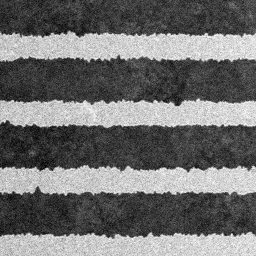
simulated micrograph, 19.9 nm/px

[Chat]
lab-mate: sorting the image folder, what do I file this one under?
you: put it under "one or a few lines or trenches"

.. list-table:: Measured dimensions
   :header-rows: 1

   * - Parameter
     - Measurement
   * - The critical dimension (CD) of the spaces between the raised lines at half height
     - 871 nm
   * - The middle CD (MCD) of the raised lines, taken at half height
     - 454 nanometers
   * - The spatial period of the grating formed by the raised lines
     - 1330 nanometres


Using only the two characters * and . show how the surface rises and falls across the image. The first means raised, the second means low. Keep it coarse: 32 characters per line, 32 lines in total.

................................
................................
................................
................................
**....**********.*.*******.***.*
********************************
********************************
**..............................
................................
................................
................................
................................
................................
********************************
********************************
..******************************
................................
................................
................................
................................
................................
********************************
********************************
********************************
................................
................................
................................
................................
................................
*******.**.*......*.********..**
********************************
********************************